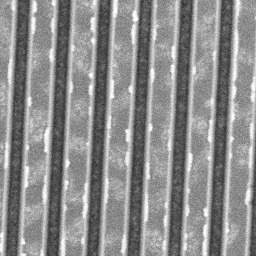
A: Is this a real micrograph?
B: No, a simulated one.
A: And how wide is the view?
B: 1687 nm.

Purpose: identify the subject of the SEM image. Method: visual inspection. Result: parallel lines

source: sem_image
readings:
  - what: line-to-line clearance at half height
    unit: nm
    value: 108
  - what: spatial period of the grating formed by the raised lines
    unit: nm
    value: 268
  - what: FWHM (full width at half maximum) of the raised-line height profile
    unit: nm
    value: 165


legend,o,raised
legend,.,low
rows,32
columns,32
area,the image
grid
oo..ooo..ooo..ooo..ooo..ooo..ooo
oo..ooo..ooo..ooo..ooo..ooo..ooo
oo..ooo..ooo..ooo..ooo..ooo..ooo
oo..ooo..ooo..ooo..ooo..ooo..ooo
oo..ooo..ooo..ooo..ooo..ooo..ooo
oo..ooo..ooo..ooo..ooo..ooo..ooo
oo..ooo..ooo..ooo..ooo..ooo..ooo
oo..ooo..ooo..ooo..ooo..ooo..ooo
o...ooo..ooo..ooo..ooo..ooo..ooo
o...ooo..ooo..ooo..ooo..ooo..ooo
o...ooo..ooo..ooo..ooo..ooo..ooo
o..oooo..ooo..ooo..ooo..ooo..ooo
o..ooo...ooo..ooo..ooo..ooo..ooo
o..ooo..ooo...ooo..ooo..ooo..ooo
o..ooo..ooo..ooo...ooo..ooo..ooo
o..ooo..ooo..ooo...oo...ooo..ooo
o..ooo..ooo..ooo...oo...ooo..ooo
o..ooo..ooo..ooo..ooo...ooo..ooo
o..ooo..ooo..ooo..ooo..ooo...ooo
o..ooo..ooo..ooo..ooo..ooo...ooo
o..ooo..ooo..ooo..ooo..ooo...oo.
o..ooo..ooo..ooo..ooo..ooo..ooo.
o..ooo..ooo..ooo..ooo..ooo..ooo.
o..ooo..ooo..ooo..ooo..ooo..ooo.
o..ooo..ooo..ooo..ooo..ooo..ooo.
o..ooo..ooo..ooo..ooo..ooo..ooo.
o..ooo..ooo..ooo..ooo..ooo..ooo.
o..ooo..ooo..ooo..ooo..ooo..ooo.
...ooo..ooo..ooo..ooo..ooo..ooo.
...ooo..ooo..ooo..ooo..ooo..ooo.
...ooo..ooo..ooo..ooo..ooo..ooo.
..oooo..ooo..ooo..ooo..ooo..ooo.